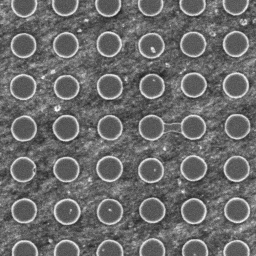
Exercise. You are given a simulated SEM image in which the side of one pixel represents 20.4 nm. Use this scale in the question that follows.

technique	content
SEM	a regular array of raised bodies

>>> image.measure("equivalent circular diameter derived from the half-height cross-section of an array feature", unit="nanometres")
505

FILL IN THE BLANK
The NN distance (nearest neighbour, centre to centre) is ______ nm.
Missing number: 842